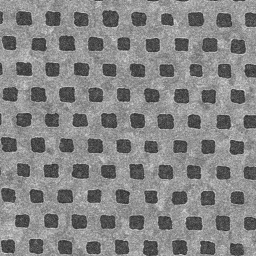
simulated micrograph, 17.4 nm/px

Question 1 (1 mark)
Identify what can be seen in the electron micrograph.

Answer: a regular array of holes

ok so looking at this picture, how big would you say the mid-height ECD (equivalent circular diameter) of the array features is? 283 nanometres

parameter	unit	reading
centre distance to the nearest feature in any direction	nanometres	492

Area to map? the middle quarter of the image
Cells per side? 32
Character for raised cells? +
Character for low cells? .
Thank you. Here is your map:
++....++++...+++....++++...++++.
++....++++...+++....++++....+++.
+++...++++...++++...++++....+++.
++++++++++++++++++..++++++++++++
++++++++++++++++++++++++++++++++
++++++++++++++++++++++++++++++++
...+++....+++...++++...+++++...+
...+++....+++....+++....+++....+
...+++....+++....+++....+++....+
...++++..+++++..+++++...++++...+
++++++++++++++++++++++++++++++++
++++++++++++++++++++++++++++++++
++...++++....++++...++++..++++++
++....+++....+++....+++....++++.
++....+++....++++...+++.....+++.
++....+++....++++...+++.....+++.
++++++++++++++++++++++++...+++++
++++++++++++++++++++++++++++++++
..++++++++++++++++++++++++++++++
..++++....+++....+++...++++....+
...+++....+++....+++....+++....+
..++++....+++....+++....+++....+
++++++++++++++++++++++.+++++++++
++++++++++++++++++++++++++++++++
++++++++++++++++++++++++++++++++
++....+++....+++....++++...++++.
++....+++....+++....+++....+++..
++....+++....+++....+++....++++.
++....++++...++++...++++...++++.
++++++++++++++++++++++++++++++++
++++++++++++++++++++++++++++++++
..++++...++++..++++++..+++++++++